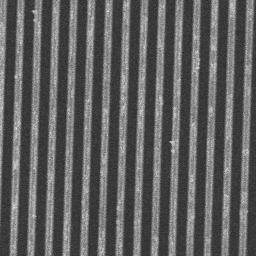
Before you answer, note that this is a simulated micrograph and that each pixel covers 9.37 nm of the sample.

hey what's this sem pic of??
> parallel lines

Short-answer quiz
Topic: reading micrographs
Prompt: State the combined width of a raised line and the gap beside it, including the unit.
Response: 165 nanometers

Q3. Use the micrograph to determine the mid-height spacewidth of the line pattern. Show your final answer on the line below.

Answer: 110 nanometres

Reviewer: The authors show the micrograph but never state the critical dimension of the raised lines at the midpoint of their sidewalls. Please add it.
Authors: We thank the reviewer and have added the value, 55 nanometres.